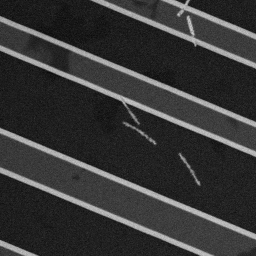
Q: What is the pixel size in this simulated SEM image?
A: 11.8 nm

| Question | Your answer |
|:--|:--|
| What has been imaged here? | groups of lines, slits or small figures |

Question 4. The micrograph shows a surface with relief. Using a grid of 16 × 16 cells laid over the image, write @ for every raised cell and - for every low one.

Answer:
-------@@@@@----
@---------@@@@--
@@@---------@@@@
-@@@@@--------@@
----@@@@--------
------@@@@@-----
--------@@@@@---
-----------@@@@-
@------------@@@
@@@-------------
@@@@@@----------
--@@@@@@--------
-----@@@@@------
-------@@@@@@---
---------@@@@@@-
@-----------@@@@